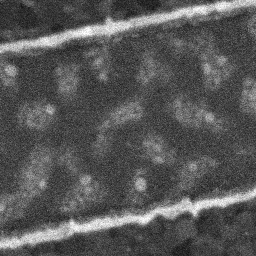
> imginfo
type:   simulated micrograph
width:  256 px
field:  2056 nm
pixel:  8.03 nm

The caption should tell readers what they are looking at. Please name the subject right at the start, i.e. one or a few lines or trenches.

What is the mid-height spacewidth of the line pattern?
1.54 micrometres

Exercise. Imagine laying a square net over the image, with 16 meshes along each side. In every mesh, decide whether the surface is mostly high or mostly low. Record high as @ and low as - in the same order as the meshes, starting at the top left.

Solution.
@@@@@@@@@@@@@---
@@@@@@@@--------
@@@-------------
----------------
----------------
----------------
----------------
----------------
----------------
----------------
----------------
----------------
--------------@@
---------@@@@@@@
----@@@@@@@@@@@@
@@@@@@@@@@@@@@@@